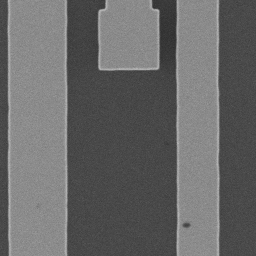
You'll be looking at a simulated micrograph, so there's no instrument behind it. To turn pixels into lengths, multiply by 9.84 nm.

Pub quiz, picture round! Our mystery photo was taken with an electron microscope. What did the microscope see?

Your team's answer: groups of lines, slits or small figures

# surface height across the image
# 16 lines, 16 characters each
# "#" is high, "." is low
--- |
.###..####.###..
.###..####.###..
.###..####.###..
.###..####.###..
.###.......###..
.###.......###..
.###.......###..
.###.......###..
.###.......###..
.###.......###..
.###.......###..
.###.......###..
.###.......###..
.###.......###..
.###.......###..
.###.......###..